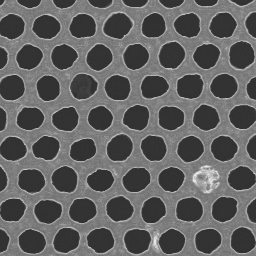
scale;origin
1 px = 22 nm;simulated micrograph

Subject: a regular array of holes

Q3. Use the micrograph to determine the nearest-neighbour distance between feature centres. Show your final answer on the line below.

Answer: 753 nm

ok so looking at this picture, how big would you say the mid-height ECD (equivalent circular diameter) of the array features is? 25.4 px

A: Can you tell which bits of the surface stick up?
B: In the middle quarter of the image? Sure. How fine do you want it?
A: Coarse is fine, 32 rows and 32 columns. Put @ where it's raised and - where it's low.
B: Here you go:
--@@@@-----@@@@@----@@@@@----@@@
@@@@@@@--@@@@@@@@@@@@@@@@@@@@@@@
@@@@-@@@@@@@@@@@@@@@@@@@@@@@@@@@
@@-----@@@@----@@@@@-----@@@@@--
@@------@@@-----@@@@------@@----
@@------@@-------@@-------@@----
@@------@@-------@@-------@@----
@@-----@@@@-----@@@@-----@@@----
@@@---@@@@@@----@@@@@-@@@@@@@@--
@@@@@@@@@@@@@@@@@@@@@@@@@@@@@@@@
@@@@@@@@@@@@@@@@@---@@@@@@@@@@@@
---@@@@----@@@@@-----@@@-----@@@
----@@------@@@------@@-------@@
----@@------@@@------@@@------@@
----@@------@@@------@@@------@@
---@@@@----@@@@@-----@@@-----@@@
--@@@@@@@@@@@@@@@@@@@@@@@@-@@@@@
@@@@@@@@@@@@@@@@@@@@@@@@@@@@@@@@
@@@@@@@@@@@@----@@@@@---@@@@@@--
@@@----@@@@------@@------@@@@---
@@------@@@------@@------@@@----
@-------@@@------@@-------@@----
@-------@@@------@@@-----@@@@---
@@-----@@@@-----@@@@@----@@@@---
@@@@@@@@@@@@@@@@@@@@@@@@@@@@@@@@
@@@@@@@@@@@@@@@@@@@@@@@@@@@@@@@@
--@@@@@@--@@@@@@-----@@@@----@@@
---@@@@-----@@@@-----@@@------@@
---@@@------@@@-------@@------@@
---@@@------@@@------@@@------@@
---@@@------@@@------@@@-----@@@
--@@@@@----@@@@@----@@@@@----@@@